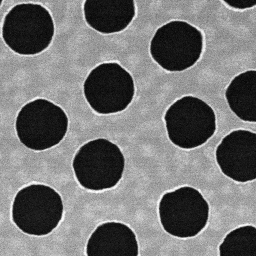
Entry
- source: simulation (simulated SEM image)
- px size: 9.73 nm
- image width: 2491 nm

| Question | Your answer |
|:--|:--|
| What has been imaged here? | a regular array of holes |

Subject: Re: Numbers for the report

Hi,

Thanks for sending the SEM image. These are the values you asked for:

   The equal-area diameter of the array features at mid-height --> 501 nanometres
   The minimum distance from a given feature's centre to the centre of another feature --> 0.752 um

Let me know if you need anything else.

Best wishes